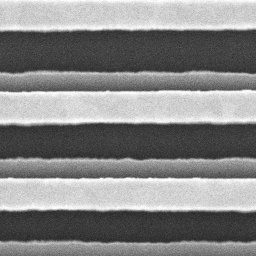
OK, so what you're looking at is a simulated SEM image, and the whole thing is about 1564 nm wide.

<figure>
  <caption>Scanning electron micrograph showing lines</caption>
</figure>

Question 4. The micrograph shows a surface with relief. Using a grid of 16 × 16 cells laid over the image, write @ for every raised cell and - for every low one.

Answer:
@@@@@@@@@@@@@@@@
@@@@@@@@@@@@@@@@
----------------
----------------
----------------
@@@@@@@@@@@@@@@@
@@@@@@@@@@@@@@@@
@@@@@@@@@@@@@@@@
----------------
----------------
@@@@@@@@@@@@@@@@
@@@@@@@@@@@@@@@@
@@@@@@@@@@@@@@@@
----------------
----------------
@@@@@@@@@@@@@@@@